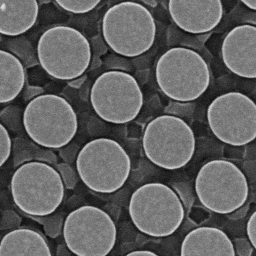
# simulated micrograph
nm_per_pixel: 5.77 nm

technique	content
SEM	a regular array of raised bodies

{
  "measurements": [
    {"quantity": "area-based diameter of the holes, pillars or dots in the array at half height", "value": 0.301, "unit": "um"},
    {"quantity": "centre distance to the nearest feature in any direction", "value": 0.397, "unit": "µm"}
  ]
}